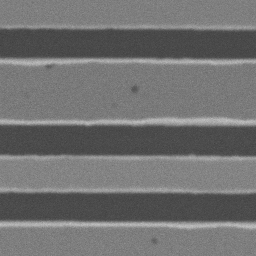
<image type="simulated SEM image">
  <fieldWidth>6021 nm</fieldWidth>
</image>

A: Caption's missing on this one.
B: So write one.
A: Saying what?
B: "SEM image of lines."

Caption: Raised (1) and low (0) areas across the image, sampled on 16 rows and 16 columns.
1111111111111111
1111111111111111
0000000000000000
0000000000000000
1111111111111111
1111111111111111
1111111111111111
1111111111111111
0000000000000000
0000000000000000
1111111111111111
1111111111111111
0000000000000000
0000000000000000
1111111111111111
1111111111111111